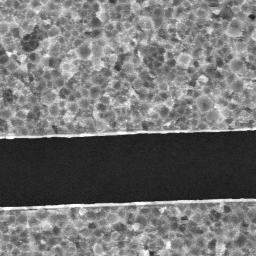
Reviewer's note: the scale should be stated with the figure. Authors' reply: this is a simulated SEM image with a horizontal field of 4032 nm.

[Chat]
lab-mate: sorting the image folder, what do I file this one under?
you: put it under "one or a few lines or trenches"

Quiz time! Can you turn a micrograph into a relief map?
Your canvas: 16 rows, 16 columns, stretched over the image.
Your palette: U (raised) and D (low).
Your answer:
UUUUUUUUUUUUUUUU
UUUUUUUUUUUUUUUU
UUUUUUUUUUUUUUUU
UUUUUUUUUUUUUUUU
UUUUUUUUUUUUUUUU
UUUUUUUUUUUUUUUU
UUUUUUUUUUUUUUUU
UUUUUUUUUUUUUUUU
UUUUDDDDDDDDDDDD
DDDDDDDDDDDDDDDD
DDDDDDDDDDDDDDDD
DDDDDDDDDDDDDDDD
DDDDDDDDDDDDDDDU
UUUUUUUUUUUUUUUU
UUUUUUUUUUUUUUUU
UUUUUUUUUUUUUUUU